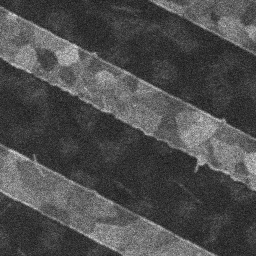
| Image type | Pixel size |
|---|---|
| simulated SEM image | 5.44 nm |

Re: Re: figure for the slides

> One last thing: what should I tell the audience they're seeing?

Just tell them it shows one or a few lines or trenches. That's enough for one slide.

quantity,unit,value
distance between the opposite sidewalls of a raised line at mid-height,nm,238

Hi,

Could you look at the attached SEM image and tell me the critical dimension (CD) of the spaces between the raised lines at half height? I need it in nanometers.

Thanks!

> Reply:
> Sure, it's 418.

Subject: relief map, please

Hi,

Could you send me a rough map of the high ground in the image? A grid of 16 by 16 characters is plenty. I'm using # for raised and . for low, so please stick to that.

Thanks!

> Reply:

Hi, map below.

..........######
##..........####
####..........##
######..........
..######........
....######......
......######....
........######..
..........#####.
#...........####
###..........###
#####..........#
.######.........
...######.......
.....######.....
.......#####....